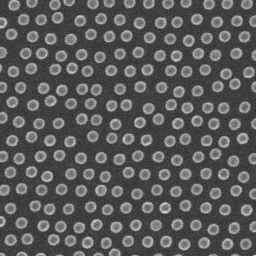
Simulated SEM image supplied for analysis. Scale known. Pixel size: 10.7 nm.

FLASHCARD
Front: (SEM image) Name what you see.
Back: a regular array of raised bodies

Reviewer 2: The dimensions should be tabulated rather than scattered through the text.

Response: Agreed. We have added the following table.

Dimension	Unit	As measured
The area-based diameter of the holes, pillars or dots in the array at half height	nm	118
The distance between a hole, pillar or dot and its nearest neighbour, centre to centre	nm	180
